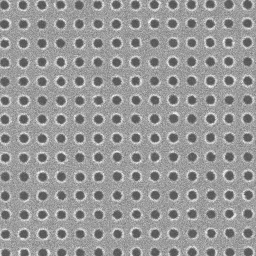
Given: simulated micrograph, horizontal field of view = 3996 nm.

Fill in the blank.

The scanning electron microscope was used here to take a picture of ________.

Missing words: a regular array of holes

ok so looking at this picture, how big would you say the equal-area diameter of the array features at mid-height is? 153 nm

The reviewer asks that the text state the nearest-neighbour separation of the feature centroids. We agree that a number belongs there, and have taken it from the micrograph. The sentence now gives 288 nanometers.